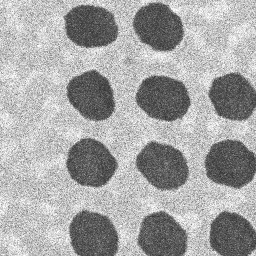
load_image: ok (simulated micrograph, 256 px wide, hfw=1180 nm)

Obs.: holes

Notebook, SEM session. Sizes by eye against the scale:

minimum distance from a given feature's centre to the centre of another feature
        67.8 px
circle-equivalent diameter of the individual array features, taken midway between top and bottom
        227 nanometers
